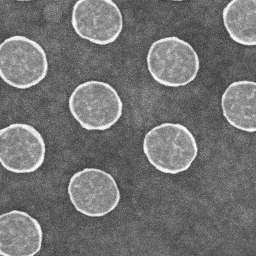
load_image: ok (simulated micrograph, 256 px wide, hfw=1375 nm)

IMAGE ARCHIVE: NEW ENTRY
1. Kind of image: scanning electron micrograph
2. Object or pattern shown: raised bodies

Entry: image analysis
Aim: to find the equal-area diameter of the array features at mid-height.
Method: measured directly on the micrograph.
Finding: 261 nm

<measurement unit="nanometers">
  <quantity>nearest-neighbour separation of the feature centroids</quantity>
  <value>461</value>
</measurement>